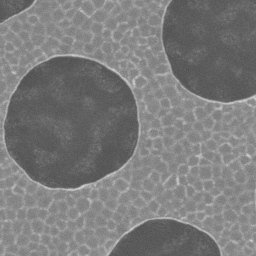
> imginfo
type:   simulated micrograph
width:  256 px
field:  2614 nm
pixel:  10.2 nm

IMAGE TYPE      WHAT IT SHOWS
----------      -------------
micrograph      holes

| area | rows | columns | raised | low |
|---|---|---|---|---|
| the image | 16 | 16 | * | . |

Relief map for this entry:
..********......
**********......
**********......
**********......
**.....****.....
*.......****....
*........*******
.........*******
.........*******
*.......********
*.......********
***...**********
****************
****************
********.....***
*******.......**